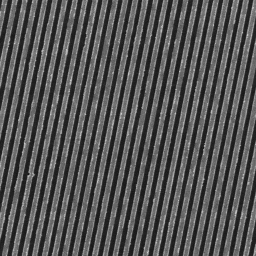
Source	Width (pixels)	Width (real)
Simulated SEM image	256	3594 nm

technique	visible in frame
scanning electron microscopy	parallel lines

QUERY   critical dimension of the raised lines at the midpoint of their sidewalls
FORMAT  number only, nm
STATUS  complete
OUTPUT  70.5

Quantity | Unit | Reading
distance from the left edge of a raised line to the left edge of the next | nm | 138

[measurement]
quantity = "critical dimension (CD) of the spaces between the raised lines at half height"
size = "0.0688 micrometres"